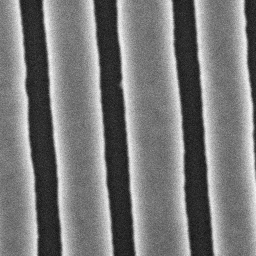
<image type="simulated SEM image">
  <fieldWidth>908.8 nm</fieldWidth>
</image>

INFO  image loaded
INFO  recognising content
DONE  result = lines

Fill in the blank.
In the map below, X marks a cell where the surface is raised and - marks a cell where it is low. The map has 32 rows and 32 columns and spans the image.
XX---XXXXXXX---XXXXXX---XXXXXX--
XX---XXXXXXX---XXXXXXX--XXXXXXX-
XXX---XXXXXX---XXXXXXX--XXXXXXX-
XXX---XXXXXX---XXXXXXX---XXXXXX-
XXX---XXXXXX---XXXXXXX---XXXXXX-
XXX---XXXXXX---XXXXXXX---XXXXXX-
XXX---XXXXXX---XXXXXXX---XXXXXX-
XXX---XXXXXX---XXXXXXX---XXXXXX-
XXX---XXXXXX---XXXXXXX---XXXXXX-
XXX---XXXXXX---XXXXXXX---XXXXXX-
XXX---XXXXXX---XXXXXXX---XXXXXX-
XXX---XXXXXXX--XXXXXXX---XXXXXX-
XXX---XXXXXXX---XXXXXXX--XXXXXX-
XXX---XXXXXXX---XXXXXXX--XXXXXXX
XXX---XXXXXXX---XXXXXXX--XXXXXXX
XXXX---XXXXXX---XXXXXXX---XXXXXX
XXXX---XXXXXX---XXXXXXX---XXXXXX
XXXX---XXXXXX---XXXXXXX---XXXXXX
XXXX---XXXXXX---XXXXXXX---XXXXXX
XXXX---XXXXXX---XXXXXXX---XXXXXX
XXXX---XXXXXX---XXXXXXX---XXXXXX
XXXX---XXXXXX---XXXXXXX---XXXXXX
XXXX---XXXXXX---XXXXXXX---XXXXXX
XXXX---XXXXXX---XXXXXXX---XXXXXX
XXXX---XXXXXX---XXXXXXX---XXXXXX
XXXX---XXXXXXX---XXXXXX---XXXXXX
XXXX---XXXXXXX---XXXXXX---XXXXXX
XXXXX--XXXXXXX---XXXXXX---XXXXXX
XXXXX---XXXXXX---XXXXXX---XXXXXX
XXXXX---XXXXXX---XXXXXX----XXXXX
XXXXX---XXXXXX---XXXXXXX---XXXXX
XXXXX---XXXXXX---XXXXXXX---XXXXX